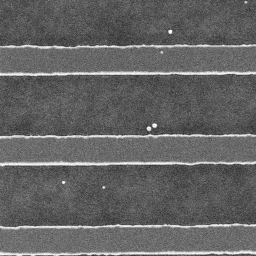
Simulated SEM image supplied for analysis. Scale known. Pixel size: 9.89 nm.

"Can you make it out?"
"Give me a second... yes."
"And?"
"lines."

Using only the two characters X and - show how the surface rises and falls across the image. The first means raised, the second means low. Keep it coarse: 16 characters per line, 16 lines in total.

----------------
----------------
----------------
XXXXXXXXXXXXXXXX
XXXXXXXXXXXXXXXX
----------------
----------------
----------------
XXXXXXXXXXXXXXXX
XXXXXXXXXXXXXXXX
----------------
----------------
----------------
----------------
XXXXXXXXXXXXXXXX
XXXXXXXXXXXXXXXX